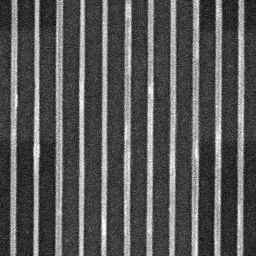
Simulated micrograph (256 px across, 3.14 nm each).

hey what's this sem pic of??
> parallel lines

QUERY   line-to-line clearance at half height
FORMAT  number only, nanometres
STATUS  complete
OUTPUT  57.7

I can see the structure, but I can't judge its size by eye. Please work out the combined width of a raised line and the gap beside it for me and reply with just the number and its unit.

22.7 pixels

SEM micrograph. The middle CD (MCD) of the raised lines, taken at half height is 15.3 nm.